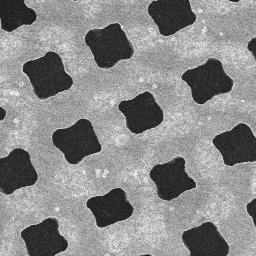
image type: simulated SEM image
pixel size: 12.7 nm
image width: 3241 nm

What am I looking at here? holes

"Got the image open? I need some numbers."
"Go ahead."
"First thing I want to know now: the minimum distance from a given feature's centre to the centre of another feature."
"67.9 pixels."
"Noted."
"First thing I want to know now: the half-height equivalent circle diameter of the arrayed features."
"0.533 µm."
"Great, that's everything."